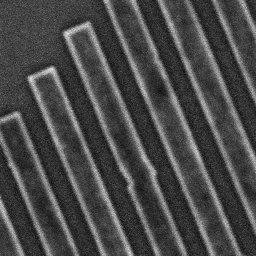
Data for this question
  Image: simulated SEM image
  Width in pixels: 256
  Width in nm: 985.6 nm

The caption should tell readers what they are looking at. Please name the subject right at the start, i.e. parallel lines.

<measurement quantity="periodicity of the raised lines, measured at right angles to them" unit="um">0.192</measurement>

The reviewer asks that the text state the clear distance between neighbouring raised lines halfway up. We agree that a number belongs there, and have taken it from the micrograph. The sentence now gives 24.7 pixels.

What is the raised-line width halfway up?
99.1 nm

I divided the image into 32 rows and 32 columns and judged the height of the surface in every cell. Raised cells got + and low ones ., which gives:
.............++++...++++...+++..
..............+++....+++...++++.
..............++++...+++....+++.
..........+....+++...++++...++++
........++++...++++...+++....+++
.........+++...++++...++++...+++
.........++++...+++....+++...+++
..........+++...++++...++++...++
..........+++....+++....+++...++
....+++...++++...++++...+++....+
....+++....+++....+++...++++...+
....++++...++++...+++....+++....
.....+++....+++...++++...++++...
.....++++...+++....+++....+++...
.+....+++...++++...++++...+++...
+++...+++....+++....+++....+++..
+++....+++...++++...++++...+++..
++++...+++....+++....+++...++++.
.+++...++++...++++...+++....+++.
.+++....+++....+++...++++...++++
.++++...++++...++++...+++....+++
..+++....+++....+++...++++...+++
..++++...+++....+++....+++...+++
...+++...++++...++++...+++....++
...++++...+++....+++...++++...++
....+++...++++...+++....+++....+
+...+++....+++...++++...++++...+
+...++++...+++....+++....+++....
+....+++....+++...++++...+++....
++...++++...+++....+++....+++...
++....+++...++++...++++...+++...
+++...+++....+++....+++...++++..